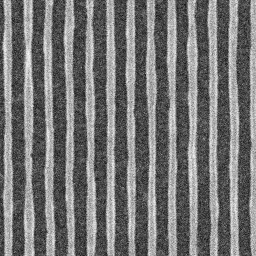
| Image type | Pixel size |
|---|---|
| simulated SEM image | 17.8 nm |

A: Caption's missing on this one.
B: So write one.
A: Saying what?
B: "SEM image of parallel lines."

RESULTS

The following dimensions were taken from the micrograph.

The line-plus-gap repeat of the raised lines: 365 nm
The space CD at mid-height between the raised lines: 0.251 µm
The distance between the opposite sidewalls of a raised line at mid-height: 0.111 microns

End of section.